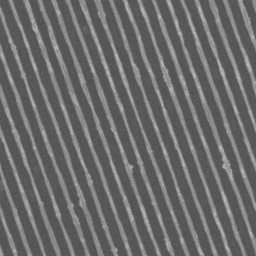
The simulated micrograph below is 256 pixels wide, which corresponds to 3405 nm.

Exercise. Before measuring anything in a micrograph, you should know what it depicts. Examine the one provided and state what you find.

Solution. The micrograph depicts parallel lines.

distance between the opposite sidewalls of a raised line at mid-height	45.4	nm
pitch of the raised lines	179	nm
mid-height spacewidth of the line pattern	133	nanometers